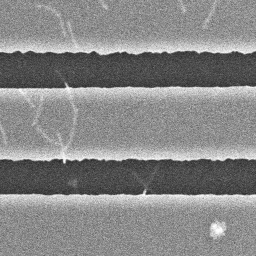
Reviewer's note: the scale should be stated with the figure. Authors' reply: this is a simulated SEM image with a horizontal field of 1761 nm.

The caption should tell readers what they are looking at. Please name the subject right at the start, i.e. lines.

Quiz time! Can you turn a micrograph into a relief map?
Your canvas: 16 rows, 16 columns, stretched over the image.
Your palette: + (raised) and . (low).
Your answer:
++++++++++++++++
++++++++++++++++
++++++++++++++++
................
................
....++++++++++++
++++++++++++++++
++++++++++++++++
++++++++++++++++
++++++++++++++++
................
................
++++++++++++++++
++++++++++++++++
++++++++++++++++
++++++++++++++++